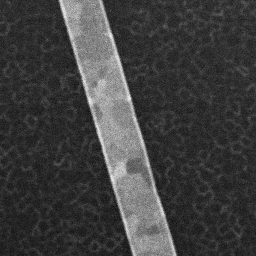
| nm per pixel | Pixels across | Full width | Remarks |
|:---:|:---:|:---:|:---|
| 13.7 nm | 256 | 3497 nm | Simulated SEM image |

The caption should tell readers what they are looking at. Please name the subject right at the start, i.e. one or a few lines or trenches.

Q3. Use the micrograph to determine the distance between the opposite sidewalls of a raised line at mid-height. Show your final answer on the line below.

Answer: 533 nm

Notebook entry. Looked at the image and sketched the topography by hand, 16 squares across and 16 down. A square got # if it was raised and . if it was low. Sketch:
....##..........
....###.........
....###.........
.....##.........
.....###........
.....###........
......##........
......##........
......###.......
.......##.......
.......##.......
.......###......
.......###......
........##......
........###.....
........###.....